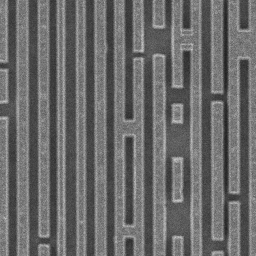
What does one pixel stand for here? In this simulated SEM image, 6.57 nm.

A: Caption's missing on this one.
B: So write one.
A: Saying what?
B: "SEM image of parallel lines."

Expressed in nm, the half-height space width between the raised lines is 64.8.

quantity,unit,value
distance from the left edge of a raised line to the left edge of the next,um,0.126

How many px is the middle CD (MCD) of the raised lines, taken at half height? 9.86